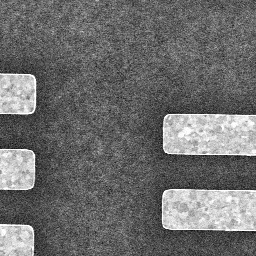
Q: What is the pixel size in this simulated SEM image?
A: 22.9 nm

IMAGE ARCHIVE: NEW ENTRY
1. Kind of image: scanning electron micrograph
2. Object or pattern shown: groups of lines, slits or small figures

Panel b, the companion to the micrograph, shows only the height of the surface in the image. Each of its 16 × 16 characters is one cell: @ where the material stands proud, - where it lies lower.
----------------
----------------
----------------
----------------
----------------
@@--------------
@@--------------
----------@@@@@@
----------@@@@@@
@@---------@@@@@
@@--------------
@@--------------
----------@@@@@@
----------@@@@@@
@@--------------
@@--------------